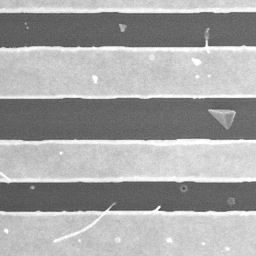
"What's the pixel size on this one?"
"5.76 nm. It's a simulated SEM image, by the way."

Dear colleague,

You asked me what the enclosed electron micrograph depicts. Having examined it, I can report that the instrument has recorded lines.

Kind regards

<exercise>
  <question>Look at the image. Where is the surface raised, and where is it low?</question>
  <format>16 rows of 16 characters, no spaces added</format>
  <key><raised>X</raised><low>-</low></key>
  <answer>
XXXXXXXXXXXXXXXX
----------------
----------------
XXXXXXXXXXXXXXXX
XXXXXXXXXXXXXXXX
XXXXXXXXXXXXXXXX
----------------
----------------
----------------
XXXXXXXXXXXXXXXX
XXXXXXXXXXXXXXXX
----------------
----------------
XXXXXXXXXXXXXXXX
XXXXXXXXXXXXXXXX
XXXXXXXXXXXXXXXX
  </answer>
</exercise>